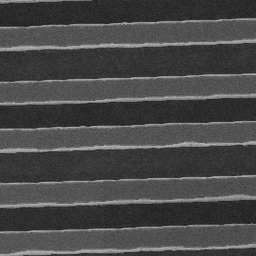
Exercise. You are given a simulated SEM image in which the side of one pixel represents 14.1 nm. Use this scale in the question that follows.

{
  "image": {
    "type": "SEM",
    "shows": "lines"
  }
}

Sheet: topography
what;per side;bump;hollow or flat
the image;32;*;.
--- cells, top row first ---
................................
................................
...........................*****
********************************
********************************
*************************.......
................................
................................
................................
.......................*********
********************************
********************************
******************..............
................................
................................
....................************
********************************
********************************
************....................
................................
................................
................................
...............*****************
********************************
********************************
**********......................
................................
................................
.................***************
********************************
********************************
**********......................